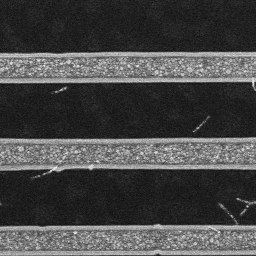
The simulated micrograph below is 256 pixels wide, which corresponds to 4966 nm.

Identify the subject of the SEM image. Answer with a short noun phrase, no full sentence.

one or a few lines or trenches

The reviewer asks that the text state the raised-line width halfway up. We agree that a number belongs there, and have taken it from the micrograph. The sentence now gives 504 nm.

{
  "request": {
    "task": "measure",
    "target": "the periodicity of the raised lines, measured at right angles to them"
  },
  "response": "1680 nm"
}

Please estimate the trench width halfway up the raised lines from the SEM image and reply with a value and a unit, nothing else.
1160 nanometers